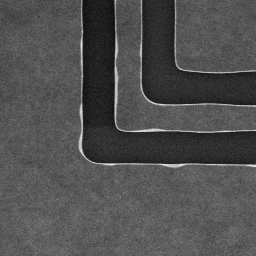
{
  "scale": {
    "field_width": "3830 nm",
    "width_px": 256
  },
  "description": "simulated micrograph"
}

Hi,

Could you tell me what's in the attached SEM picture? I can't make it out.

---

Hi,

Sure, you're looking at groups of lines, slits or small figures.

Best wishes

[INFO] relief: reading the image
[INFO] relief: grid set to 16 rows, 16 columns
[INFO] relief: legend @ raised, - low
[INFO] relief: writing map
@@@@@--@@--@@@@@
@@@@@--@@--@@@@@
@@@@@--@@--@@@@@
@@@@@--@@--@@@@@
@@@@@--@@---@@@-
@@@@@--@@-------
@@@@@--@@@--@@--
@@@@@--@@@@@@@@@
@@@@@-----------
@@@@@-----------
@@@@@@@@@@@@@@@@
@@@@@@@@@@@@@@@@
@@@@@@@@@@@@@@@@
@@@@@@@@@@@@@@@@
@@@@@@@@@@@@@@@@
@@@@@@@@@@@@@@@@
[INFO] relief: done